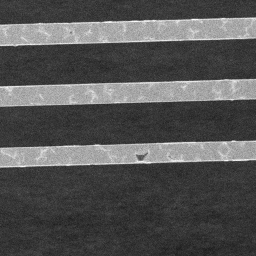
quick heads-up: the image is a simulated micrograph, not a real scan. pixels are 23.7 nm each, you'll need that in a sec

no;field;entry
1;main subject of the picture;one or a few lines or trenches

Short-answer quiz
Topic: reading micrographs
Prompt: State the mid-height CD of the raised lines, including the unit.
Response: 468 nanometres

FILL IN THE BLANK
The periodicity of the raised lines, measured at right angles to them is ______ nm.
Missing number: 1450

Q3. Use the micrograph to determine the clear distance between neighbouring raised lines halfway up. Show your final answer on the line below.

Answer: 41.4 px